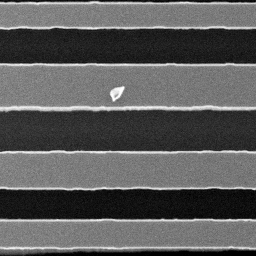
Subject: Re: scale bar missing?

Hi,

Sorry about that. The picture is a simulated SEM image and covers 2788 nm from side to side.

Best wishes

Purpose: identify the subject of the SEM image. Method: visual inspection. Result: lines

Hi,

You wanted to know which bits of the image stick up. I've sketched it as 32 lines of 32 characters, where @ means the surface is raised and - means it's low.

@@@@@@@@@@@@@@@@@@@@@@@@@@@@@@@@
@@@@@@@@@@@@@@@@@@@@@@@@@@@@@@@@
@@@@@@@@@@@@@@@@@@@@@@@@@@@@@@@@
@@---------@@-------------------
--------------------------------
--------------------------------
--------------------------------
--------------------------------
@@@@@@@@@@@@@@@@@@@@@@@@@@@@@@@@
@@@@@@@@@@@@@@@@@@@@@@@@@@@@@@@@
@@@@@@@@@@@@@@@@@@@@@@@@@@@@@@@@
@@@@@@@@@@@@@@@@@@@@@@@@@@@@@@@@
@@@@@@@@@@@@@@@@@@@@@@@@@@@@@@@@
-----@-@----------------------@-
--------------------------------
--------------------------------
--------------------------------
--------------------------------
--------------------------------
@@@@@@@@@@@@@@@@@@@@@@@@@@@@@@@@
@@@@@@@@@@@@@@@@@@@@@@@@@@@@@@@@
@@@@@@@@@@@@@@@@@@@@@@@@@@@@@@@@
@@@@@@@@@@@@@@@@@@@@@@@@@@@@@@@@
@@@@@@@@@@@@@@@@@@@@@@@@@@-@@@@@
--------------------------------
--------------------------------
--------------------------------
@------@---@@@@---@-@@@-@@@-@@@@
@@@@@@@@@@@@@@@@@@@@@@@@@@@@@@@@
@@@@@@@@@@@@@@@@@@@@@@@@@@@@@@@@
@@@@@@@@@@@@@@@@@@@@@@@@@@@@@@@@
--------------------------------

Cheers